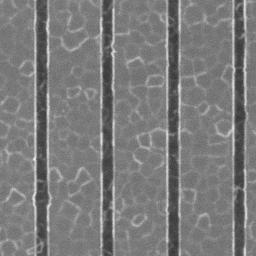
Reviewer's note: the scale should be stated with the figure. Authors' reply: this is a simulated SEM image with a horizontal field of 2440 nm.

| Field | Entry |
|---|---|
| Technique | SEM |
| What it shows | one or a few lines or trenches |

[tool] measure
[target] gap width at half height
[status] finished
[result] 52.9 px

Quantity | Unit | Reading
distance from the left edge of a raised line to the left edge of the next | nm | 628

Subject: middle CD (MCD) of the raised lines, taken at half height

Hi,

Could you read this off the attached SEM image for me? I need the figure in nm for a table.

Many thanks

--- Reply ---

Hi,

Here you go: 126